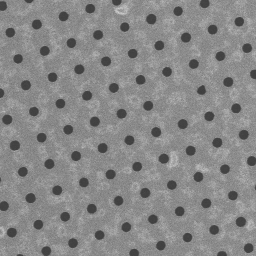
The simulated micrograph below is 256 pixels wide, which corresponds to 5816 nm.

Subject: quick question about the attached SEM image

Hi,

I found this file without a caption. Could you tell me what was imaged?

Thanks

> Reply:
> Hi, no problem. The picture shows a regular array of holes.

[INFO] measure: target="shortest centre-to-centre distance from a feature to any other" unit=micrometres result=0.624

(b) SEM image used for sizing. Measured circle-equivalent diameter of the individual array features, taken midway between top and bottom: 10 pixels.